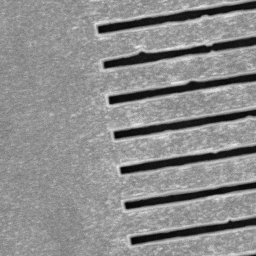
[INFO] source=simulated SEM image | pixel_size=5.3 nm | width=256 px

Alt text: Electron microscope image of parallel lines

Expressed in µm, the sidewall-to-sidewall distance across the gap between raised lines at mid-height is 0.0491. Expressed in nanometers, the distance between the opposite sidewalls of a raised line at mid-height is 143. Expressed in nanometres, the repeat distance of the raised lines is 189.